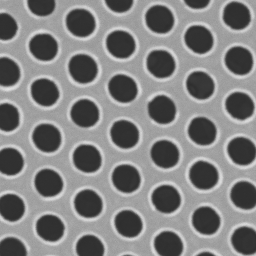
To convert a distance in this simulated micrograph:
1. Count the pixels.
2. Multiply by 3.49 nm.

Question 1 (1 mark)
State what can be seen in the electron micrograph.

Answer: a regular array of holes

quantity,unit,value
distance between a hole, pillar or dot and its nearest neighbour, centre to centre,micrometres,0.155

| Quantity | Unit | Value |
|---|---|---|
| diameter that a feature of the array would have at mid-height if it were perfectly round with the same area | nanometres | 97.3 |